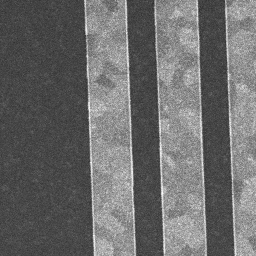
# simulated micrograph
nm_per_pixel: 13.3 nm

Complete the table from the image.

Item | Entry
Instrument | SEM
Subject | one or a few lines or trenches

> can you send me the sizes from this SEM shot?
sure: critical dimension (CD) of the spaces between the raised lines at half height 382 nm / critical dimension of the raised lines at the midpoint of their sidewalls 542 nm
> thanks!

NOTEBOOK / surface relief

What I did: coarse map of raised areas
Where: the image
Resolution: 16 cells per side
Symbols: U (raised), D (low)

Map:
DDDDDUUUDDUUDDUU
DDDDDUUUDDUUDDUU
DDDDDUUUDDUUDDUU
DDDDDUUUDDUUDDUU
DDDDDUUUDDUUDDUU
DDDDDDUUDDUUDDUU
DDDDDDUUDDUUUDUU
DDDDDDUUDDUUUDUU
DDDDDDUUDDUUUDUU
DDDDDDUUDDUUUDUU
DDDDDDUUDDUUUDUU
DDDDDDUUDDUUUDDU
DDDDDDUUDDUUUDDU
DDDDDDUUDDUUUDDU
DDDDDDUUDDUUUDDU
DDDDDDUUDDUUUDDU